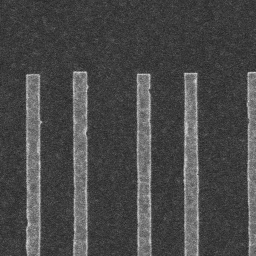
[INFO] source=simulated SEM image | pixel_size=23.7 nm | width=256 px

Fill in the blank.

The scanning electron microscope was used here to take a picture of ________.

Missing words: parallel lines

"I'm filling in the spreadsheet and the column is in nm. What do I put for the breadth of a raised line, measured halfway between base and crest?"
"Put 302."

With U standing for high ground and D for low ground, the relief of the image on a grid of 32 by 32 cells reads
DDDDDDDDDDDDDDDDDDDDDDDDDDDDDDDD
DDDDDDDDDDDDDDDDDDDDDDDDDDDDDDDD
DDDDDDDDDDDDDDDDDDDDDDDDDDDDDDDD
DDDDDDDDDDDDDDDDDDDDDDDDDDDDDDDD
DDDDDDDDDDDDDDDDDDDDDDDDDDDDDDDD
DDDDDDDDDDDDDDDDDDDDDDDDDDDDDDDD
DDDDDDDDDDDDDDDDDDDDDDDDDDDDDDDD
DDDDDDDDDDDDDDDDDDDDDDDDDDDDDDDD
DDDDDDDDDDDDDDDDDDDDDDDDDDDDDDDD
DDDDUDDDDUUDDDDDDUUDDDDUUDDDDDDU
DDDUUDDDDUUDDDDDDUUDDDDUDDDDDDDU
DDDUUDDDDUUDDDDDDUUDDDDUUDDDDDDU
DDDUUDDDDUUDDDDDDUUDDDDUUDDDDDDU
DDDUUDDDDUUDDDDDDUUDDDDUUDDDDDDU
DDDUUDDDDUUDDDDDDUUDDDDUUDDDDDDU
DDDUUDDDDUUDDDDDDUUDDDDUUDDDDDDU
DDDUUDDDDUUDDDDDDUUDDDDUUDDDDDDU
DDDUUDDDDUUDDDDDDUUDDDDUUDDDDDDU
DDDUUDDDDUUDDDDDDUUDDDDUUDDDDDDU
DDDUUDDDDUUDDDDDDUUDDDDUUDDDDDDU
DDDUUDDDDUUDDDDDDUUDDDDUUDDDDDDU
DDDUUDDDDUUDDDDDDUUDDDDUUDDDDDDU
DDDUUDDDDUUDDDDDDUUDDDDUUDDDDDDU
DDDUUDDDDUUDDDDDDUUDDDDUUDDDDDDU
DDDUUDDDDUUDDDDDDUUDDDDUUDDDDDDU
DDDUUDDDDUUDDDDDDUUDDDDUUDDDDDDU
DDDUUDDDDUUDDDDDDUUDDDDUUDDDDDDU
DDDUUDDDDUUDDDDDDUUDDDDUUDDDDDDU
DDDUUDDDDUUDDDDDDUUDDDDUUDDDDDDU
DDDUUDDDDUUDDDDDDUUDDDDUUDDDDDDU
DDDUUDDDDDUDDDDDDUUDDDDUUDDDDDDU
DDDUUDDDDUUDDDDDDUUDDDDUUDDDDDDU